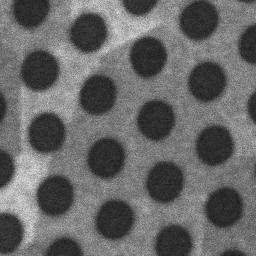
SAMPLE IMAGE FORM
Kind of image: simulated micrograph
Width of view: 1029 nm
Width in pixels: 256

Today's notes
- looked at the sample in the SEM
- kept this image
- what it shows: a regular array of holes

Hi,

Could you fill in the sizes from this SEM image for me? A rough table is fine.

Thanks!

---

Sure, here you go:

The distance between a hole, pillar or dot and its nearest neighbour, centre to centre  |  62.5 pixels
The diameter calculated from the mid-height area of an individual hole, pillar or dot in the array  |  39.5 pixels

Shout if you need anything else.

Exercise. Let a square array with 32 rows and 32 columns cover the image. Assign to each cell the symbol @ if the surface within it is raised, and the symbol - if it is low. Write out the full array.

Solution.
@@----@@@@@@@@@-----@@@@---@@@@@
@@----@@@@@@@@@@---@@@@----@@@@@
@@----@@@----@@@@@@@@@-----@@@@@
@@@-@@@@@----@@@@@@@@@@----@@@@-
@@@@@@@@@----@@@@@@@@@@---@@@@--
@@@@@@@@@----@@@@---@@@@@@@@@@--
@@@@--@@@@--@@@@-----@@@@@@@@@--
@@@----@@@@@@@@@-----@@@@@@@@@@-
@@@----@@@@@@@@@@---@@@@----@@@@
@@@----@@@@--@@@@--@@@@@----@@@@
@@@----@@@----@@@@@@@@@@----@@@@
@@@@@@@@@@-----@@@@@@@@@----@@@@
-@@@@@@@@@----@@@@@-@@@@@--@@@@-
-@@@@@@@@@----@@@@---@@@@@@@@@@-
-@@@@--@@@@@@@@@@-----@@@@@@@@@-
@@@@----@@@@@@@@@-----@@@@@@@@@@
@@@@----@@@@@@@@@@---@@@@----@@@
@@@@----@@@@---@@@@-@@@@@----@@@
@@@@---@@@@----@@@@@@@@@-----@@@
-@@@@@@@@@@-----@@@@@@@@@----@@@
--@@@@@@@@@-----@@@@--@@@@--@@@@
--@@@@@@@@@----@@@@----@@@@@@@@@
-@@@@----@@@@@@@@@-----@@@@@@@@@
@@@@@----@@@@@@@@@-----@@@@@-@@@
@@@@@----@@@@@@@@@@---@@@@----@@
@@@@@----@@@@---@@@@@@@@@@----@@
@@@@@---@@@@-----@@@@@@@@@----@@
--@@@@@@@@@@-----@@@@@@@@@----@@
---@@@@@@@@@----@@@@---@@@@@@@@@
---@@@@@@@@@@---@@@@----@@@@@@@@
---@@@----@@@@@@@@@-----@@@@@@@@
--@@@@----@@@@@@@@@-----@@@@--@@